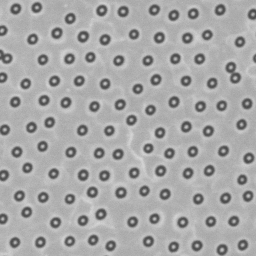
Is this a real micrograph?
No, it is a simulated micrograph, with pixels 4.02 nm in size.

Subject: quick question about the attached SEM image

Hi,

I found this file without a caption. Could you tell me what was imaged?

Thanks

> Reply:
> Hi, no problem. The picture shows a regular array of ring-shaped grooves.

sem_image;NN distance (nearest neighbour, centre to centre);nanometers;87.1